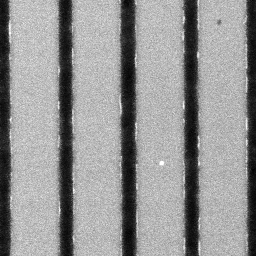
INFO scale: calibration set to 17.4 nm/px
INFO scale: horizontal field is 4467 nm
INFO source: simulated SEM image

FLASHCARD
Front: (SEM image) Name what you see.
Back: one or a few lines or trenches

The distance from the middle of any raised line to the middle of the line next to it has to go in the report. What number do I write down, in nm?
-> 1090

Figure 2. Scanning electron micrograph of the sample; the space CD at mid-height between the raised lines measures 816 nm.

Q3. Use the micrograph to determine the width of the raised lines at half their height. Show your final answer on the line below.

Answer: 275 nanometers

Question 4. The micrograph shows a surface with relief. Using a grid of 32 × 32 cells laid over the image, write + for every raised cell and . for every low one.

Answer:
+......++......++......++......+
+......++......++......++......+
+......++..............++......+
+......++......++......++......+
+......++......++......++......+
+......++......++......++......+
+......++......++......++......+
+......++......++......++......+
+......++......++......++......+
+......++......++......++......+
+......++......++......++......+
+......++......++......++......+
+......++......++......++......+
+......++......++......++......+
+......++......++......++......+
+......++......++......++......+
+......++......++......++......+
+......++......++......++......+
+......++......++......++......+
+......++......++......++......+
+......++......++......++......+
+......++......++......++......+
+......++......++......++......+
+......++......++......++......+
+......++......++......++......+
+......++......++......++......+
+......++......++......++......+
+......++......++......++......+
+......++......++......++......+
+......++......++......++......+
+......++......++......++......+
+......++......++......++......+